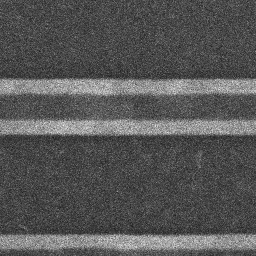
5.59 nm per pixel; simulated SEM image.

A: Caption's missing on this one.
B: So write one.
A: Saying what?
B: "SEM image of one or a few lines or trenches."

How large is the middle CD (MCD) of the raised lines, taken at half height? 224 nm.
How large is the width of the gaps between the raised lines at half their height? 115 pixels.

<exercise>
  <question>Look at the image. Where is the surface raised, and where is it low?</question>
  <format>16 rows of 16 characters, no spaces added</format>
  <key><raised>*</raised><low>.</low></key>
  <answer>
................
................
................
................
................
********..******
****************
****************
................
................
................
................
................
................
................
****************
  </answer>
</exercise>